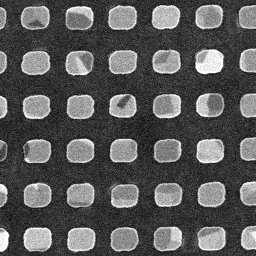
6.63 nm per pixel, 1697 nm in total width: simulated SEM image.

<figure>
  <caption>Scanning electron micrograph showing a regular array of raised bodies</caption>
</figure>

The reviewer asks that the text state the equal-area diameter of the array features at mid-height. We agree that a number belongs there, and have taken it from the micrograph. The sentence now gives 177 nm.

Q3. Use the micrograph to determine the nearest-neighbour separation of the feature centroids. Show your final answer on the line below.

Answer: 287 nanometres